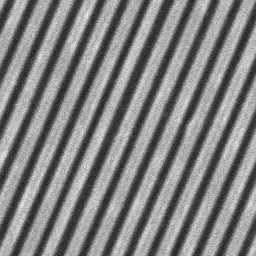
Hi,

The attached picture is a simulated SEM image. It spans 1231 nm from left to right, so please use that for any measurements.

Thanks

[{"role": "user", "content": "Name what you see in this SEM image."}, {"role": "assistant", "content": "parallel lines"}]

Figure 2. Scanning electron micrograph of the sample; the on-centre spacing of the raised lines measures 101 nanometers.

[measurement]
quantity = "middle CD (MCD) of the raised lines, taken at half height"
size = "50.8 nanometres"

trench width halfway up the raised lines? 10.6 px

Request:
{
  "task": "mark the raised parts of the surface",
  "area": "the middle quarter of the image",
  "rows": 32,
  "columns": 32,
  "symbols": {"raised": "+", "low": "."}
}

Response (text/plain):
+...++....++...++....++....++...
...+++...+++...++...+++...+++...
...++....++...++....+++...++....
...++...+++...++....++...+++...+
..+++...++...++....+++...++....+
..++...+++...++....++...+++...++
.+++...+++..+++...+++...+++...++
.++....++...++....++....++...+++
.++...+++...++...+++...+++...++.
++....++...++....+++...++...+++.
++...+++...++....++...+++...+++.
++...+++..++....+++...++....++..
+...+++...++....++...+++...+++..
+...+++..+++...+++...+++...++...
+...++...++....++....++...+++...
...+++...++...+++...+++...++...+
...++...+++...+++...++...+++...+
..+++...++....++...+++...+++...+
..+++..+++...+++...++....++...++
.+++...++....++...+++...+++...++
.+++..+++...+++...+++...++...+++
.++...++....+++...++...+++...+++
+++...++...+++...+++...++...+++.
++...+++...+++...++...+++...+++.
++...++....++...+++...+++...++..
+...+++...+++...++....++...+++..
+...++....++...+++...+++...+++..
+..+++...+++...+++...++...+++...
...++....+++...++...+++...+++...
...++...+++...+++...++...+++...+
..++....+++...++...+++...+++...+
..++....++...+++...+++...++...++